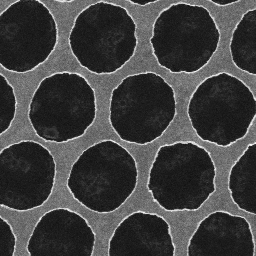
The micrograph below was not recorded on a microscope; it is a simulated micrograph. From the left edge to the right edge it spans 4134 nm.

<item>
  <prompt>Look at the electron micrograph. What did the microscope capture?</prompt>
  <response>holes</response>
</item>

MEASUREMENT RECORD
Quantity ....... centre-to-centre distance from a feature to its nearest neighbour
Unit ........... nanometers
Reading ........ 1280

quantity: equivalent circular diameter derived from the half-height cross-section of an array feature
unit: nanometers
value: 1100